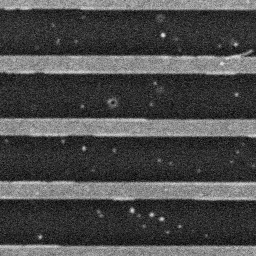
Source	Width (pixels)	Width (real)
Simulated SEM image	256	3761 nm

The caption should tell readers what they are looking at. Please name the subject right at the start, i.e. lines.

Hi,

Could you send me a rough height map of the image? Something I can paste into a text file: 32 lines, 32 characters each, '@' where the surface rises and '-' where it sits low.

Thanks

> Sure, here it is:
@@@@@@@@@@@@@@@@@@@@@@@@@@@@@@@@
--------------------------------
--------------------------------
--------------------------------
--------------------------------
--------------------------------
--------------------------------
@@@@@@@@@@@@@@@@@@@@@@@@@@@@@@@@
@@@@@@@@@@@@@@@@@@@@@@@@@@@@@@@@
--------------------------------
--------------------------------
--------------------------------
--------------------------------
--------------------------------
--------------------------------
@@@@@@@@@@@@@@@@@@@@@@@@@@@@@@@@
@@@@@@@@@@@@@@@@@@@@@@@@@@@@@@@@
--------------------------------
--------------------------------
--------------------------------
--------------------------------
--------------------------------
--------------------------------
@@@@@@@@@@@@@@@@@@@@@@@@@@@@@@@@
@@@@@@@@@@@@@@@@@@@@@@@@@@@@@@@@
--------------------------------
--------------------------------
--------------------------------
--------------------------------
--------------------------------
--------------------------------
@@@@@@@@@@@@@@@@@@@@@@@@@@@@@@@@